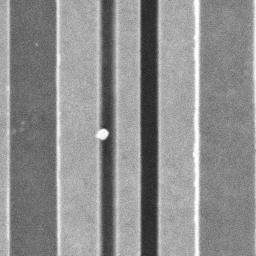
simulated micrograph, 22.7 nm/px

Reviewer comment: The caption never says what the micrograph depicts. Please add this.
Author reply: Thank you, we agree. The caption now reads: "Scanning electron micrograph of lines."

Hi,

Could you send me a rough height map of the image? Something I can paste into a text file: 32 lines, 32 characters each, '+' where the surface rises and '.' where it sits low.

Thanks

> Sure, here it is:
+......+++++...++...+++++.......
+......+++++...++...++++........
+......+++++...++...++++........
+......+++++...++...++++........
+......+++++...++...++++........
+......+++++...++...++++........
+......+++++...++...++++........
+......+++++...++...++++........
+......+++++...++...++++........
+......+++++...++...+++++.......
+......+++++...++...++++........
+......+++++...++...++++........
+......+++++...++...++++........
+......+++++...++...++++........
+......+++++...++...++++........
+......+++++...++...++++........
+......++++++..++...++++........
+......++++++..++...++++........
+......+++++...++...+++++.......
+......+++++...++...+++++.......
+......+++++...++...++++........
+......+++++...++...++++........
+......+++++...++...++++........
+......+++++...++...++++........
+......+++++...++...++++........
+......+++++...++...++++........
+......+++++...++...++++........
+......+++++...++...++++........
+......+++++...++...++++........
+......+++++...++...++++........
+......+++++...++...++++........
+......+++++...++...++++........